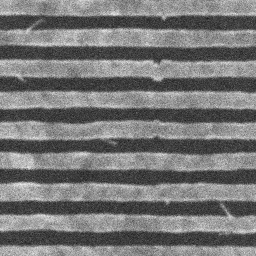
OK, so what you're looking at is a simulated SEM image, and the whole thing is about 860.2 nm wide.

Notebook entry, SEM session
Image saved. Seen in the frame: parallel lines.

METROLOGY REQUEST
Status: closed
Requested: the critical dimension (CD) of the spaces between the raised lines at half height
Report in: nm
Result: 53.8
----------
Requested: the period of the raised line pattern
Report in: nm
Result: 104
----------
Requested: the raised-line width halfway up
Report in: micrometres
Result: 0.0509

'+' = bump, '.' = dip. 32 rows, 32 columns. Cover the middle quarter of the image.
++++++++++++++++++++++++++++++++
++++++++++++++++++++++++++++++++
++++++++++++++++++++++++++++++++
......................+++.......
................................
................................
................................
++++++++++++++++++++++++++++++++
++++++++++++++++++++++++++++++++
++++++++++++++++++++++++++++++++
+++..+++++++++++++++++++++++++++
................................
................................
................................
...............+++....++........
++++++++++++++++++++++++++++++++
++++++++++++++++++++++++++++++++
++++++++++++++++++++++++++++++++
++++++..........................
................................
................................
................................
+++++++...........+++++.........
++++++++++++++++++++++++++++++++
++++++++++++++++++++++++++++++++
++++++++++++++++++++++++++++++++
.............................+++
................................
................................
................................
++++++++++++++++......++++++++++
++++++++++++++++++++++++++++++++